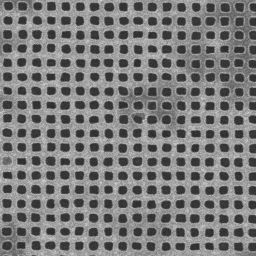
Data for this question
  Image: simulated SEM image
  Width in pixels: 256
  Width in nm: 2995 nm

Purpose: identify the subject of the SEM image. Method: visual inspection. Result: a regular array of holes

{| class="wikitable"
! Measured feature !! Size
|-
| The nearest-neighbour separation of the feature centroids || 162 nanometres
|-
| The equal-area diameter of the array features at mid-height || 112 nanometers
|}